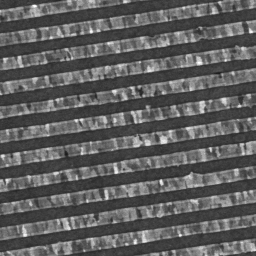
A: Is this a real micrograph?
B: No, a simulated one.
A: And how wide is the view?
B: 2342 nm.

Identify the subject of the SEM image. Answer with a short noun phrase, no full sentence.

parallel lines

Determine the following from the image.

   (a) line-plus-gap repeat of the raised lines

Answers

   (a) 0.219 um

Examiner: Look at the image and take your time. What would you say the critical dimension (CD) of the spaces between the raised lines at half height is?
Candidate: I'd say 127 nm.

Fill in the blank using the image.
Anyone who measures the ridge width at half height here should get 95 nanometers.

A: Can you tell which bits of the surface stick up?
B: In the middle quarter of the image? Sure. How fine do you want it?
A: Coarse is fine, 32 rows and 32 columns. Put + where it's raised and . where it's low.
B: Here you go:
.............++++++++++++++++++.
.......++++++++++++++++.........
++++++++++++++++................
++++++++++......................
+++........................+++++
...................+.+++++++++++
..............+++++++++++++++++.
.......+++++++++++++++++........
.++++++++++++++++...............
+++++++++++.....................
++..........................++++
......................++++++++++
.............+.++++++++++++++++.
........+++++++++++++++++.......
.+++++++++++++++++..............
+++++++++++.....................
++++++......................++++
......................++++++++++
................++++++++++++++++
.........+++++++++++++++++......
.++++++++++++++++...............
+++++++++++.....................
++++........................++++
......................++++++++++
...............+++++++++++++++++
..........+++++++++++++++.......
..++++++++++++++++..............
++++++++++......................
+++++........................+++
......................++++++++++
................++++++++++++++++
........++++++++++++++++++......